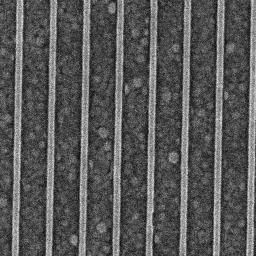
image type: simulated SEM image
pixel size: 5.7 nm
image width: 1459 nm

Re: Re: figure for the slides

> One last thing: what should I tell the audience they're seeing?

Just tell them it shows parallel lines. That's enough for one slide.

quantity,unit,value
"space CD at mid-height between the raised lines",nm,159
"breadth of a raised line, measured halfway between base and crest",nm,32.1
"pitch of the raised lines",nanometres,191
